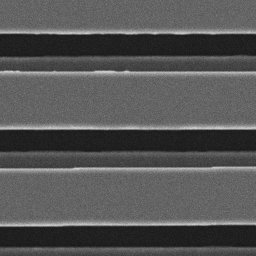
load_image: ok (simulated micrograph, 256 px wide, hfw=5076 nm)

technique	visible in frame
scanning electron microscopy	lines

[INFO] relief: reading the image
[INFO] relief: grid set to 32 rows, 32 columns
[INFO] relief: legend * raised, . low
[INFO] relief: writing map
********************************
********************************
********************************
********************************
................................
................................
................................
********************************
********************************
********************************
********************************
********************************
********************************
********************************
********************************
********************************
................................
................................
................................
********************************
********************************
********************************
********************************
********************************
********************************
********************************
********************************
********************************
................................
................................
................................
********************************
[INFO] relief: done